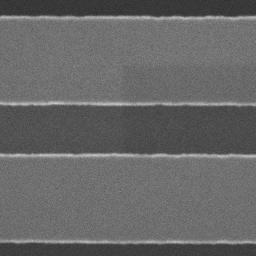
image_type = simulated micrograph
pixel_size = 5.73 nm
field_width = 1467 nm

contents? lines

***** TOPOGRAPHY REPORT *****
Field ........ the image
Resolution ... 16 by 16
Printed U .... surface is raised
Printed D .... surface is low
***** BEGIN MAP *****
DDDDDDDDDDDDDDDD
UUUUUUUUUUUUUUUU
UUUUUUUUUUUUUUUU
UUUUUUUUUUUUUUUU
UUUUUUUUUUUUUUUU
UUUUUUUUUUUUUUUU
UUUDDUUUUUUUUUUU
DDDDDDDDDDDDDDDD
DDDDDDDDDDDDDDDD
DDDDDDDDDDDDDDDD
UUUUUUUUUUUUUUUU
UUUUUUUUUUUUUUUU
UUUUUUUUUUUUUUUU
UUUUUUUUUUUUUUUU
UUUUUUUUUUUUUUUU
DDDDDDDDDDDDDDDD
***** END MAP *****